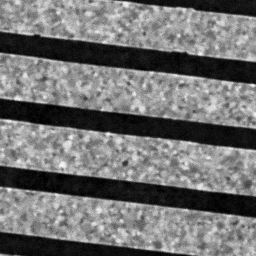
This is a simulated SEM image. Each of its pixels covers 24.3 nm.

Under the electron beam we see one or a few lines or trenches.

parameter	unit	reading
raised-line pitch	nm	1610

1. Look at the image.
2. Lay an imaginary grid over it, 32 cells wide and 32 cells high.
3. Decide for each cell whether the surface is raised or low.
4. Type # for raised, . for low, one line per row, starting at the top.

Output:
##################..............
##########################......
################################
################################
......##########################
..............##################
.......................#########
######........................##
###############.................
#######################.........
###############################.
################################
...#############################
..........######################
...................#############
#####......................#####
############....................
#####################...........
############################....
################################
################################
.......#########################
...............#################
#......................#########
#########.......................
#################...............
#########################.......
################################
################################
.....###########################
.............###################
.....................###########